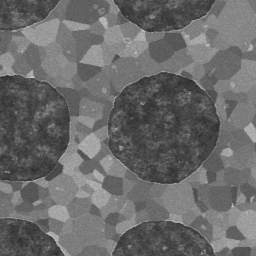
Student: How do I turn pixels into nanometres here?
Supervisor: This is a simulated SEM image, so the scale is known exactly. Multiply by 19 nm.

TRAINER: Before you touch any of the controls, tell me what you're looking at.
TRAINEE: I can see holes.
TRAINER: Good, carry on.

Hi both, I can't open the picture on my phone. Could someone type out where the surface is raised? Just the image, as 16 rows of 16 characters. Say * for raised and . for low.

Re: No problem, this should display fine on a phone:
...****......***
..******....****
****************
****************
****************
...*****.....***
....***......***
....***.......**
....***.......**
....***......***
...*****....****
****************
****************
****************
...*****....****
....***......***